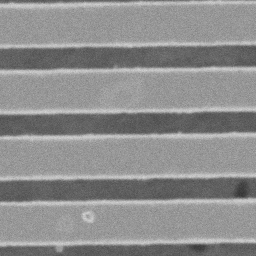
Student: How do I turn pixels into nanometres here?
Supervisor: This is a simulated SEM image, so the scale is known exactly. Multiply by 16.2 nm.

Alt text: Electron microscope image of lines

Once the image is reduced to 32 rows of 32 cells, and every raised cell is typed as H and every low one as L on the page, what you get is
LLLLLLLLLLHHHHHHHHHHHHHHHHHHHHHH
HHHHHHHHHHHHHHHHHHHHHHHHHHHHHHHH
HHHHHHHHHHHHHHHHHHHHHHHHHHHHHHHH
HHHHHHHHHHHHHHHHHHHHHHHHHHHHHHHH
HHHHHHHHHHHHHHHHHHHHHHHHHHHHHHHH
HHHHHHHHHHHHHHHHHHHHHHHHHHHHHHHH
LLLLLLLLLLLLLLLLLLLLLLLLLLLLLLLL
LLLLLLLLLLLLLLLLLLLLLLLLLLLLLLLL
LLLLLLLLLLLLLLLLLLLLLLLLLLLHHHHH
HHHHHHHHHHHHHHHHHHHHHHHHHHHHHHHH
HHHHHHHHHHHHHHHHHHHHHHHHHHHHHHHH
HHHHHHHHHHHHHHHHHHHHHHHHHHHHHHHH
HHHHHHHHHHHHHHHHHHHHHHHHHHHHHHHH
HHHHHHHHHHHHHHHHHHHHHHHHHHHHHHHH
LLLLLLLLLLLLLLLLLLLLLLLLLLLLLLLL
LLLLLLLLLLLLLLLLLLLLLLLLLLLLLLLL
LLLLLLLLLLLLLLLLLLLLLLLLLLLLLLLL
HHHHHHHHHHHHHHHHHHHHHHHHHHHHHHHH
HHHHHHHHHHHHHHHHHHHHHHHHHHHHHHHH
HHHHHHHHHHHHHHHHHHHHHHHHHHHHHHHH
HHHHHHHHHHHHHHHHHHHHHHHHHHHHHHHH
HHHHHHHHHHHHHHHHHHHHHHHHHHHHHHHH
LLLLLLLLLLLLLLLLLLLLLLLLLLLLLLLL
LLLLLLLLLLLLLLLLLLLLLLLLLLLLLLLL
LLLLLLLLLLLLLLLLLLLLLLLLLLLLLLLL
HHHHHHHHHHHHHHHHHHHHHHHHHHHHHHHH
HHHHHHHHHHHHHHHHHHHHHHHHHHHHHHHH
HHHHHHHHHHHHHHHHHHHHHHHHHHHHHHHH
HHHHHHHHHHHHHHHHHHHHHHHHHHHHHHHH
HHHHHHHHHHHHHHHHHHHHHHHHHHHHHHHH
HHHHHHHHHHHHHHHHLLLLLLLLLLLLLLLL
LLLLLLLLLLLLLLLLLLLLLLLLLLLLLLLL